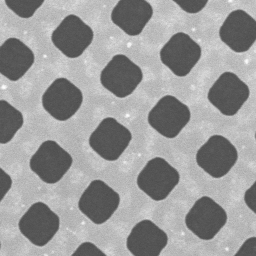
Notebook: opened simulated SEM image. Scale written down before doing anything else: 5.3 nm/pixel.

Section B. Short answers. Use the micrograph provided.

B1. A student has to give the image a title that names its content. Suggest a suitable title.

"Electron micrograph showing a regular array of holes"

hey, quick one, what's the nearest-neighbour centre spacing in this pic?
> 330 nanometres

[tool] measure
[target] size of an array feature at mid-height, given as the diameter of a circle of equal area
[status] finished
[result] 213 nm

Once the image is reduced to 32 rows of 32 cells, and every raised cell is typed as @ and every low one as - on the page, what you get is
@----@@@@@@@@@@----@@@----@@@@@@
@@--@@@@@@@@@@-----@@@@--@@@@--@
@@@@@@@@--@@@@-----@@@@@@@@@----
@@@@@@@----@@@@---@@@@@@@@@-----
@@@@@@------@@@@@@@@@@--@@@-----
---@@@@----@@@@@@@@@@----@@@----
----@@@@--@@@@@@@@@@-----@@@@-@@
----@@@@@@@@@@--@@@@-----@@@@@@@
----@@@@@@@@@----@@@@---@@@@@@@@
---@@@@@@@@@@-----@@@@-@@@@---@@
@@@@@@---@@@@----@@@@@@@@@@----@
@@@@@@----@@@@---@@@@@@@@@-----@
@@@@@-----@@@@@@@@@@--@@@@-----@
--@@@-----@@@@@@@@@----@@@@---@@
---@@@---@@@@@@@@@------@@@@@@@@
---@@@@@@@@@---@@@@----@@@@@@@@@
--@@@@@@@@@@----@@@@--@@@@@@@@@@
-@@@@@@@@@@-----@@@@@@@@@@---@@@
@@@@@---@@@-----@@@@@@@@@----@@@
@@@@-----@@@---@@@@@@@@@@-----@@
@@@@-----@@@@@@@@@---@@@@----@@@
-@@@----@@@@@@@@@@----@@@@---@@@
-@@@@--@@@@@@@@@@-----@@@@@@@@@@
-@@@@@@@@@@---@@@-----@@@@@@@@@-
-@@@@@@@@@-----@@@@--@@@@@@@@@@-
@@@@--@@@@-----@@@@@@@@@---@@@@-
@@@----@@@----@@@@@@@@@@----@@@@
@@-----@@@@--@@@@@@@@@@-----@@@@
@@-----@@@@@@@@@@---@@@@----@@@@
@@@----@@@@@@@@@-----@@@@--@@@@@
@@@@--@@@@--@@@@-----@@@@@@@@@--
@@@@@@@@@----@@@----@@@@@@@@@@--